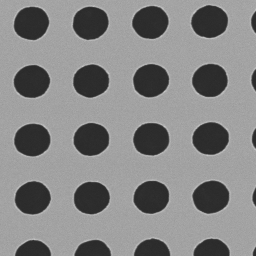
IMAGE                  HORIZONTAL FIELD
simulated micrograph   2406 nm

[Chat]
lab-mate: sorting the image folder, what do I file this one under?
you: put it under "a regular array of holes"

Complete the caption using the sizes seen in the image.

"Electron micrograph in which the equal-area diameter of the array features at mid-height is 34.2 pixels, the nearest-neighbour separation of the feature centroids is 548 nanometers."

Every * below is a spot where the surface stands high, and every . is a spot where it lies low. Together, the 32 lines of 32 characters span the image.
********************************
**....****...****....***....****
**....***....****....***....***.
**....***....****....***....****
***..*****...*****..*****..*****
********************************
********************************
********************************
***..*****...*****..*****...****
**....***.....***....***....***.
**....***.....***....***....***.
**....****...****...*****...****
********************************
********************************
********************************
***********.******..*****..*****
**....***....****....***....****
**....***.....***....***.....***
**....****...****....***....****
********************************
********************************
********************************
********************************
**....****...****....****...****
**....***.....***....***.....***
**....***.....***....***....****
***..*****..******..*****..*****
********************************
********************************
********************************
***...****...****....****...****
**....***.....***....***.....***